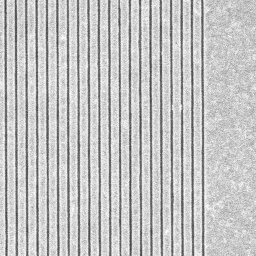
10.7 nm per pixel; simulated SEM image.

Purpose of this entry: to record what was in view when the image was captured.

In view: parallel lines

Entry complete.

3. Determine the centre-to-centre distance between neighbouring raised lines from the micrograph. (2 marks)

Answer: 0.11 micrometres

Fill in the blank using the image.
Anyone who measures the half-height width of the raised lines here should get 7.75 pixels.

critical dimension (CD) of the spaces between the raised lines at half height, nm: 28